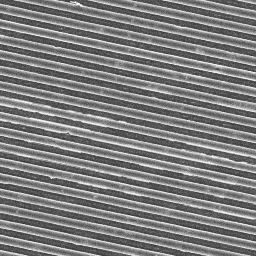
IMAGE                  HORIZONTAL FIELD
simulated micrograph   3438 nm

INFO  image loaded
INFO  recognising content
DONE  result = parallel lines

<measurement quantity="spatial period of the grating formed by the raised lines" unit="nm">202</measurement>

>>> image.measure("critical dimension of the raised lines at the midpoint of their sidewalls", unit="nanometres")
113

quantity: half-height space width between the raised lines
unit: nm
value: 88.8